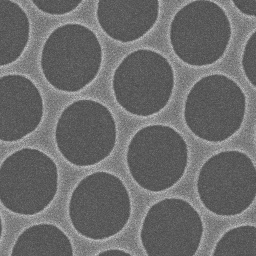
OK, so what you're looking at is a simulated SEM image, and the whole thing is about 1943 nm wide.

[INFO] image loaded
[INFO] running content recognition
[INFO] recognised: holes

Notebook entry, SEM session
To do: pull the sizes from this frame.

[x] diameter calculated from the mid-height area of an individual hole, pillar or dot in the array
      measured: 64 px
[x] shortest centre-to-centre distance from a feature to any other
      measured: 573 nanometres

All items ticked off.